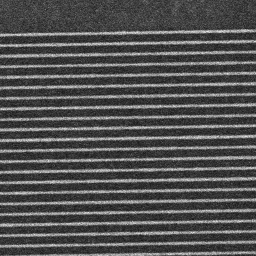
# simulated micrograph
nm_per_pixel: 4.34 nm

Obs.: parallel lines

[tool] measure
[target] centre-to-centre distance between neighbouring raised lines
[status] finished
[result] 45.8 nm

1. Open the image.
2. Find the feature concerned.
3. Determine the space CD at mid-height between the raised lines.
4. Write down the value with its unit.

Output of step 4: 36.3 nm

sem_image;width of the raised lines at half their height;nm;10.8